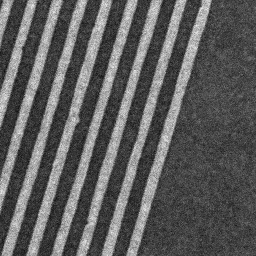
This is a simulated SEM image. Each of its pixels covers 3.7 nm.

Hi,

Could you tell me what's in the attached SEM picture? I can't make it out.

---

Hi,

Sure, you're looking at parallel lines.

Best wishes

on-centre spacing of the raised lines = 88.1 nanometers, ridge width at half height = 33.2 nm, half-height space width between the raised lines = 53.6 nanometres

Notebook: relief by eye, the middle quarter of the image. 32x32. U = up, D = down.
UDDDDUUDDDDUUDDDDUUDDDDUUUDDDDUU
UDDDUUUDDDDUUDDDDUUDDDDUUDDDDUUU
DDDDUUDDDDUUUDDDDUUDDDDUUDDDDUUD
DDDDUUDDDDUUDDDDUUUDDDUUUDDDDUUD
DDDDUUDDDDUUDDDDUUDDDDUUDDDDUUUD
DDDUUUDDDDUUDDDDUUDDDDUUDDDDUUDD
DDDUUDDDDUUUDDDUUUDDDDUUDDDDUUDD
DDDUUDDDDUUDDDDUUDDDDUUUDDDDUUDD
DDDUUDDDDUUDDDDUUDDDDUUDDDDUUUDD
DDUUDDDDUUUDDDDUUDDDDUUDDDDUUDDD
DDUUDDDDUUDDDDUUUDDDUUUDDDDUUDDD
DDUUDDDDUUDDDDUUDDDDUUUDDDUUUDDD
DUUDDDDDUUDDDDUUDDDDUUDDDDUUDDDD
DUUUDDDUUUDDDUUUDDDDUUDDDDUUDDDD
DUUUDDDUUDDDDUUDDDDUUDDDDUUUDDDD
DUUDDDDUUDDDDUUDDDDUUDDDDUUUDDDD
UUDDDDUUUDDDUUUDDDDUUDDDDUUDDDDD
UUDDDDUUDDDDUUDDDDDUUDDDUUUDDDDD
UUDDDDUUDDDDUUDDDDUUDDDDUUUDDDDD
UDDDDUUUDDDDUUDDDDUUDDDDUUDDDDDD
UDDDDUUDDDDUUUDDDDUUDDDDUUDDDDDD
UDDDDUUDDDDUUDDDDDUDDDDUUUDDDDDD
UDDDDUUDDDUUUDDDDUUDDDDUUDDDDDDD
DDDDUUUDDDUUUDDDDUUDDDDUUDDDDDDD
DDDDUUDDDDUUDDDDUUDDDDDUUDDDDDDD
DDDDUUDDDDUUDDDDUUDDDDUUUDDDDDDD
DDDUUUDDDUUUDDDDUUDDDDUUDDDDDDDD
DDDUUDDDDUUDDDDDUUDDDDUUDDDDDDDD
DDDUUDDDDUUDDDDUUDDDDUUUDDDDDDDD
DDDUUDDDUUUDDDDUUDDDDUUDDDDDDDDD
DDUUDDDDUUUDDDDUUDDDDUUDDDDDDDDD
DDUUDDDDUUDDDDUUDDDDUUUDDDDDDDDD